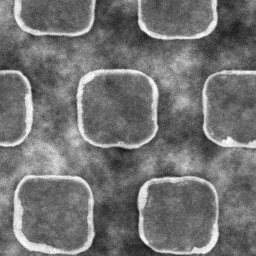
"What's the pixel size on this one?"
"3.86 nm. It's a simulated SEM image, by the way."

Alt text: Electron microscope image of raised bodies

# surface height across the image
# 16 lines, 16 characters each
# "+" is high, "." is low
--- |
.+++++...++++...
.+++++...++++...
................
................
+.....+++.....++
++...+++++...+++
++...+++++...+++
++...+++++...+++
++...+++++...+++
................
................
.++++....++++...
.+++++...+++++..
.+++++...+++++..
.+++++...++++...
..+++....++++...